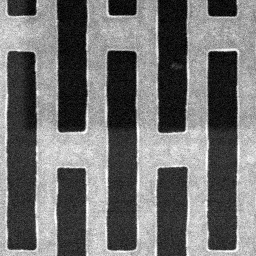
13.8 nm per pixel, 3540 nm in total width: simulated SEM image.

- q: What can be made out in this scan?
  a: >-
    groups of lines, slits or small figures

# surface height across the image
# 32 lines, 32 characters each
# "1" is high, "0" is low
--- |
10000110000110000111000111000011
10000110000110000111000111000011
11111110000111111111000111111111
11111110000111111111000111111111
11111110000111111111000111111111
11111110000111111111000111111111
10001110000111000111000111000011
10000110000110000111000111000011
10000110000110000111000111000011
10000110000110000111000011000011
10000110000110000111000011000011
10000110000110000111000111000011
10000110000110000111000111000011
10000110000110000111000111000011
10000110000110000111000111000011
10000110000110000111000111000011
10000110001110000111000111000011
10000111111110000111111111000011
10000111111110000111111111000011
10000111111110000111111111000011
10000111111110000111111111000011
10000110000110000111000011000011
10000110000110000111000111000011
10000110000110000110000111000011
10000110000110000110000111000011
10000110000110000110000011000011
10000110000110000110000011000011
10000110000110000110000111000011
10000110000110000110000111000011
10000110000110000110000111000011
10000110000110000110000111000011
11111110000111111110000111111111